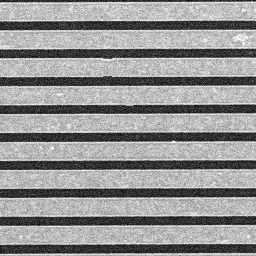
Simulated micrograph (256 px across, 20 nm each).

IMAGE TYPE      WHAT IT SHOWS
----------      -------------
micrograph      parallel lines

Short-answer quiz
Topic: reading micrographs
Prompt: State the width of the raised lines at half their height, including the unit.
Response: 18.6 pixels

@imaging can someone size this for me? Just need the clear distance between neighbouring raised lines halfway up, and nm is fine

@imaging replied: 185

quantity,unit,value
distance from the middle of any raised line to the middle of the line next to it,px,27.9